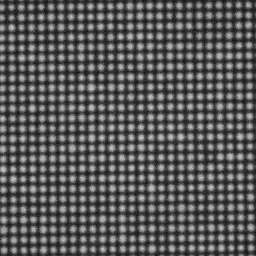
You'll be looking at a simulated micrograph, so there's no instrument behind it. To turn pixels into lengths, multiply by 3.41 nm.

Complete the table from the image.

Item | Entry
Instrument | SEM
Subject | a regular array of raised bodies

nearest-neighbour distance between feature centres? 32.7 nanometres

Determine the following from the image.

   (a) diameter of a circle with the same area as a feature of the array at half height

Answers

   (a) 21.1 nanometers